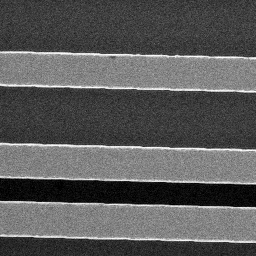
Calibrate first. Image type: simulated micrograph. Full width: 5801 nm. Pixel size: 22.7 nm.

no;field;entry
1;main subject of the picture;lines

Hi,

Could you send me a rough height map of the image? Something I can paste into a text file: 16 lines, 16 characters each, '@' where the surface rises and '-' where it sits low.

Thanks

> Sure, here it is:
----------------
----------------
----------------
@@@@@@@@@@@-----
@@@@@@@@@@@@@@@@
------@@@@@@@@@@
----------------
----------------
----------------
@@@@@@@@@@@@@@@@
@@@@@@@@@@@@@@@@
----------------
----------------
@@@@@@@@@@@@@@@@
@@@@@@@@@@@@@@@@
----------------